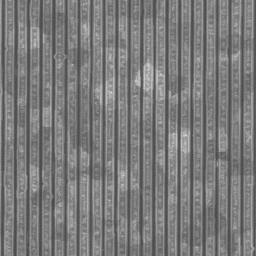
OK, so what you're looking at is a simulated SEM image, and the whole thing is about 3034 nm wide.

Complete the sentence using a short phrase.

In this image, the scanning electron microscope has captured parallel lines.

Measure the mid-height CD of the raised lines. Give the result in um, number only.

0.0859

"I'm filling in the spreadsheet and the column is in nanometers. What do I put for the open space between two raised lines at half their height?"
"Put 63.7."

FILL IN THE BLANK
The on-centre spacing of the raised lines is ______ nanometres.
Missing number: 149